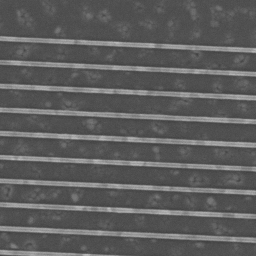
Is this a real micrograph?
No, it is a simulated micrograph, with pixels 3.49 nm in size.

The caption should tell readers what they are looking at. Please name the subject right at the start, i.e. parallel lines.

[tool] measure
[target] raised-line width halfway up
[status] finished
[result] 3.61 pixels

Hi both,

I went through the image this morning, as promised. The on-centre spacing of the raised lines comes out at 0.0828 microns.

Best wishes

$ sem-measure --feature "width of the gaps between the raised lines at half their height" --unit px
20.7